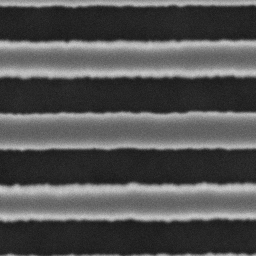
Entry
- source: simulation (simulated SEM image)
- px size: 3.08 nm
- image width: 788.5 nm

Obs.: lines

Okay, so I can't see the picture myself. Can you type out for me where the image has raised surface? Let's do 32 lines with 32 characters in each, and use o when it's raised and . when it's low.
oooooooooooooooooooooooooooooooo
................................
................................
................................
................................
oooooooooooooooooooooooooooooooo
oooooooooooooooooooooooooooooooo
oooooooooooooooooooooooooooooooo
oooooooooooooooooooooooooooooooo
ooooooooooooooooooooooooooo..ooo
................................
................................
................................
................................
oooooooooooooooooooooooooooooooo
oooooooooooooooooooooooooooooooo
oooooooooooooooooooooooooooooooo
oooooooooooooooooooooooooooooooo
ooooooooooooooo..oooooooooo.oooo
................................
................................
................................
................................
oooooooooooooooooooooooooooooooo
oooooooooooooooooooooooooooooooo
oooooooooooooooooooooooooooooooo
oooooooooooooooooooooooooooooooo
oooooooooooooooo.ooooooo.o......
................................
................................
................................
................................